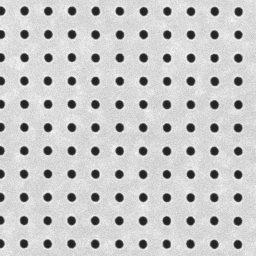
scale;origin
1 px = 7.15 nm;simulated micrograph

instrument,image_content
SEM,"a regular array of holes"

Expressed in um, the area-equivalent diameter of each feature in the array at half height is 0.0623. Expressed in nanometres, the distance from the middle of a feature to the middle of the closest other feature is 165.